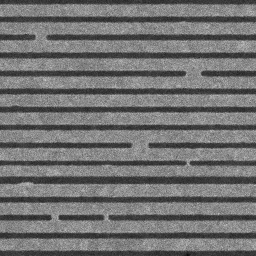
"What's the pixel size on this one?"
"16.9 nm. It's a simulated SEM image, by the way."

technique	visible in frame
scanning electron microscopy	parallel lines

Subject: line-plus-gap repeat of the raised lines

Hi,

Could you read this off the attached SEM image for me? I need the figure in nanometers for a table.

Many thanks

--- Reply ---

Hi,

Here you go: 305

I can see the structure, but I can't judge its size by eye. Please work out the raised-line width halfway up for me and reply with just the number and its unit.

0.193 µm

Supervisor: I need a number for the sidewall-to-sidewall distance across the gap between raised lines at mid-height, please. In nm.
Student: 112